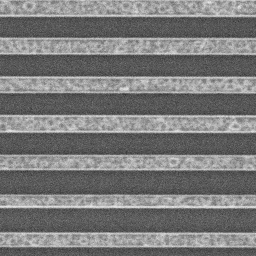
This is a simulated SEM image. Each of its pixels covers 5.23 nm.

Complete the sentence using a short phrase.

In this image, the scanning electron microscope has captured parallel lines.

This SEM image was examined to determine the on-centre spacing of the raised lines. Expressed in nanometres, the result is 203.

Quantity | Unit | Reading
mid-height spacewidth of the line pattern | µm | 0.124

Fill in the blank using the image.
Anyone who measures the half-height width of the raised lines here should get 14.6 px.